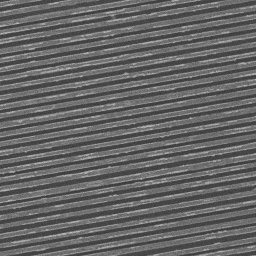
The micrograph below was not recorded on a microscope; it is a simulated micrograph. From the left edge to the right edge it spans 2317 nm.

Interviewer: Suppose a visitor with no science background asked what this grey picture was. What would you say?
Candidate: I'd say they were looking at parallel lines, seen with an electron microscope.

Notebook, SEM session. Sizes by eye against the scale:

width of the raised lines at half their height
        0.0457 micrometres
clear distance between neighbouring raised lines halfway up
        37.9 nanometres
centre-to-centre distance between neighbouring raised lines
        82.4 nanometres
